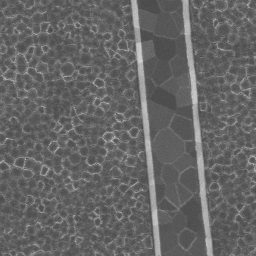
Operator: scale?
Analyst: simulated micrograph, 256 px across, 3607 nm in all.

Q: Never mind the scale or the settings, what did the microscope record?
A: one or a few lines or trenches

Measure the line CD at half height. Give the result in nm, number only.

710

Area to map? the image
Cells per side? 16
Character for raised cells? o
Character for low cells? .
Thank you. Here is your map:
........oooo....
........oooo....
.........ooo....
.........ooo....
.........ooo....
.........ooo....
.........ooo....
.........ooo....
.........ooo....
.........ooo....
.........oooo...
.........oooo...
..........ooo...
..........ooo...
..........ooo...
..........ooo...